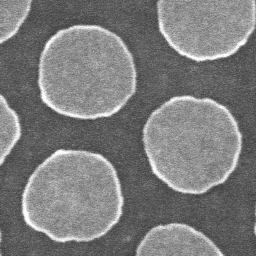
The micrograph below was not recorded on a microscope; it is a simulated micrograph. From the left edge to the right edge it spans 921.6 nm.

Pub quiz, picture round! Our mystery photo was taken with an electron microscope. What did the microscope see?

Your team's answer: raised bodies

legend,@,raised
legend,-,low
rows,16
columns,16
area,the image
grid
@@--------@@@@@@
@---------@@@@@@
---@@@@---@@@@@-
---@@@@@----@@--
--@@@@@@--------
---@@@@@--------
---@@@@@--@@@@--
@--------@@@@@@-
@--------@@@@@@-
----@----@@@@@@-
--@@@@@---@@@@@-
--@@@@@---@@@---
-@@@@@@@--------
--@@@@@---------
---@@@@--@@@----
---------@@@@@--